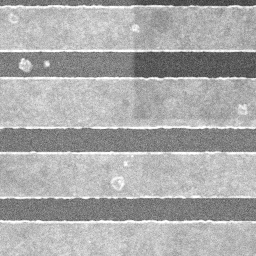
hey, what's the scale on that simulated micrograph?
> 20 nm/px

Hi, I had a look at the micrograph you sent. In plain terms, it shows lines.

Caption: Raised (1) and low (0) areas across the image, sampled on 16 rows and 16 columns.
1111111111111111
1111111111111111
1111111111111111
0000000000000000
0000000000000000
1111111111111111
1111111111111111
1111111111111111
0000000000000000
0000000000000000
1111111111111111
1111111111111111
0000000000000000
0000000000000000
1111111111111111
1111111111111111